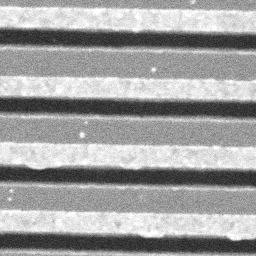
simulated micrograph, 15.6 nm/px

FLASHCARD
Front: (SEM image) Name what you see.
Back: lines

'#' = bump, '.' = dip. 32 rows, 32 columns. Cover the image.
################################
################################
################################
..........######################
................................
................................
###########################.....
################################
################################
################################
################################
################################
................................
................................
##..............................
################################
################################
################################
################################
################################
...#############################
................................
................................
###################.............
################################
################################
################################
################################
################################
..................##........####
................................
................................